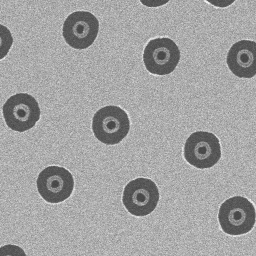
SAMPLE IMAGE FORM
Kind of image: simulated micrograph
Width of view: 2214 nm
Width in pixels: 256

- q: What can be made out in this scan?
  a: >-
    ring-shaped grooves with a dot in the middle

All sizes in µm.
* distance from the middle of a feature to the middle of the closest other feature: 0.689